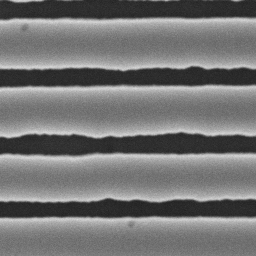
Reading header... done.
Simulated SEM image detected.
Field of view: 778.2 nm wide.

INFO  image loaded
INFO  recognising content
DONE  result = lines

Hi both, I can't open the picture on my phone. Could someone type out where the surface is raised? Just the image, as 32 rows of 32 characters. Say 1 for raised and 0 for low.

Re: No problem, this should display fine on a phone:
00000000000000000000000000000000
00000000000000000000000000000000
01111111111111111111111111111111
11111111111111111111111111111111
11111111111111111111111111111111
11111111111111111111111111111111
11111111111111111111111111111111
11111111111111111111111111111111
11111111000001111100001000101001
00000000000000000000000000000000
00000000000000000000000000000000
11111111111111111111111111111111
11111111111111111111111111111111
11111111111111111111111111111111
11111111111111111111111111111111
11111111111111111111111111111111
11111111111111111111111111111111
00000000000000000000000000000000
00000000000000000000000000000000
11111111001111111111111111111111
11111111111111111111111111111111
11111111111111111111111111111111
11111111111111111111111111111111
11111111111111111111111111111111
11111111111111111111111111111111
00000000000000000000000000000000
00000000000000000000000000000000
11111111111111111111111111111111
11111111111111111111111111111111
11111111111111111111111111111111
11111111111111111111111111111111
11111111111111111111111111111111